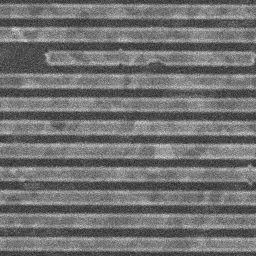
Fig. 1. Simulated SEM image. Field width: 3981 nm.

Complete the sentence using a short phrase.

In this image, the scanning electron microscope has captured parallel lines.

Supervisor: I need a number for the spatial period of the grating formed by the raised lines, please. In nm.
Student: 362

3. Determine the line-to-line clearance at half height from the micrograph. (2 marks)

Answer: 0.183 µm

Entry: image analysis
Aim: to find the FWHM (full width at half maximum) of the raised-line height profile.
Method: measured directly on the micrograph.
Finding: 183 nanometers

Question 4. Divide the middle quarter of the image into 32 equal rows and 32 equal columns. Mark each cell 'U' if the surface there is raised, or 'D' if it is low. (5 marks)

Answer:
DDDDDDDDDDDDDDDDDDDDDDDDDDDDDDDD
DDDDDDDDDDDDDDDDDDDDDDDDDDDDDDDD
DDDDDDDDDDDDDDDDDDDDDDDDDDDDDDDD
UUUUUUUUUUUUUUUUUUUUUUUUUUUUUUUU
UUUUUUUUUUUUUUUUUUUUUUUUUUUUUUUU
UUUUUUUUUUUUUUUUUUUUUUUUUUUUUUUU
DDDDDDDDDDDDDDDDDDDDDDDDDDDDDDDD
DDDDDDDDDDDDDDDDDDDDDDDDDDDDDDDD
DDDDDDDDDDDDDDDDDDDDDDDDDDDDDDDD
UUUUUUUUUUUUUUUUUUUUUUUUUUUUUUUU
UUUUUUUUUUUUUUUUUUUUUUUUUUUUUUUU
DDDDDDDDDDDDDDDDDDDDDUUUUUUUUUUU
DDDDDDDDDDDDDDDDDDDDDDDDDDDDDDDD
DDDDDDDDDDDDDDDDDDDDDDDDDDDDDDDD
DDDDDDDDDDDDDDDDDDDDDDDDDDDDDDDD
UUUUUUUUUUUUUUUUUUUUUUUUUUUUUUUU
UUUUUUUUUUUUUUUUUUUUUUUUUUUUUUUU
DDDDDDDDDDDDDDDDDDDDDDDDDDDDDDDD
DDDDDDDDDDDDDDDDDDDDDDDDDDDDDDDD
DDDDDDDDDDDDDDDDDDDDDDDDDDDDDDDD
UUUUUUUUUUUUUUUUUUUDUUUUUUUUUUUU
UUUUUUUUUUUUUUUUUUUUUUUUUUUUUUUU
UUUUUUUUUUUUUUUUUUUUUUUUUUUUUUUU
DDDDDDDDDDDDDDDDDDDDDDDDDDDDDDDD
DDDDDDDDDDDDDDDDDDDDDDDDDDDDDDDD
DDDDDDDDDDDDDDDDDDDDDDDDDDDDDDDD
UUUUUUUUUUUUUUUUUUUUUUUUUUUUUUUU
UUUUUUUUUUUUUUUUUUUUUUUUUUUUUUUU
UUUUUUUUUUUUUUUUUUUUUUUUUUUUUUUU
DDDDDDDDDDDDDDDDDDDDDDDDDDDDDDDD
DDDDDDDDDDDDDDDDDDDDDDDDDDDDDDDD
DDDDDDDDDDDDDDDDDDDDDDDDDDDDDDDD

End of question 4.